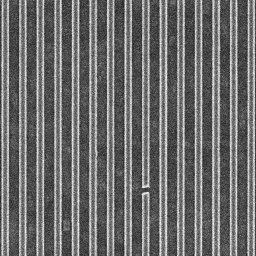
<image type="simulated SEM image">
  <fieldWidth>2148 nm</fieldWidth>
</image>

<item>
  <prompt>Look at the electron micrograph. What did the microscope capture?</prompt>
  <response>parallel lines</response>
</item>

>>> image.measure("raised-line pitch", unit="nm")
148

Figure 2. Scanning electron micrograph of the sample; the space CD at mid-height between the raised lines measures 0.0923 um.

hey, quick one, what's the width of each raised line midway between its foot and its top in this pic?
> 49.3 nm